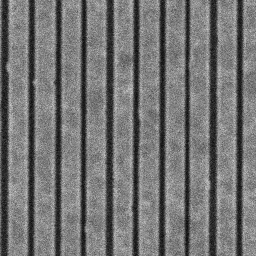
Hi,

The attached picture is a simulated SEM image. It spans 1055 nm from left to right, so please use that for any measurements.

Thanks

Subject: parallel lines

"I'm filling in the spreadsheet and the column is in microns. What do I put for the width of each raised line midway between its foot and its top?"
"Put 0.0767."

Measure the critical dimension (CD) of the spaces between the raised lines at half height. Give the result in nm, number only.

29.8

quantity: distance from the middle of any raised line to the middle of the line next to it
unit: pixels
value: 26